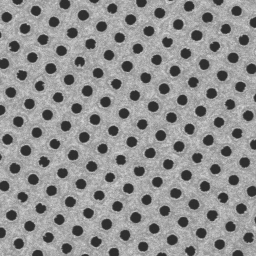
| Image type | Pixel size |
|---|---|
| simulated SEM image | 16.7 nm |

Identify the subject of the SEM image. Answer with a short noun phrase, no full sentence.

a regular array of holes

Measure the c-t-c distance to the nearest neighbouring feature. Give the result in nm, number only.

346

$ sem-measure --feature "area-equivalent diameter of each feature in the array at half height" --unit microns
0.181